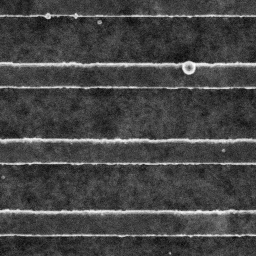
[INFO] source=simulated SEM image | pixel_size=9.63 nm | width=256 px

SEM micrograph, lines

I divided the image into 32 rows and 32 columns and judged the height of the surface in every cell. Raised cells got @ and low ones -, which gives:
@@@@@@@@@@@@@@@@@@@@@@@@@@@@@@@@
@@@@@@@@@@@@@@@@@@@@@@@@@@@@@@@@
--------------------------------
--------------------------------
--------------------------------
--------------------------------
--------------------------------
--------------------------------
@@@@@@@@@@@@@@@@@@@@@@@@@@@@@@@@
@@@@@@@@@@@@@@@@@@@@@@@@@@@@@@@@
@@@@@@@@@@@@@@@@@@@@@@@@@@@@@@@@
--------------------------------
--------------------------------
--------------------------------
--------------------------------
--------------------------------
--------------------------------
---@@@--------------------------
@@@@@@@@@@@@@@@@@@@@@@@@@@@@@@@@
@@@@@@@@@@@@@@@@@@@@@@@@@@@@@@@@
--------------------------------
--------------------------------
--------------------------------
--------------------------------
--------------------------------
--------------------------------
@@@@-@-@@@@@@@@@@@@@@@@-@@@@@@@@
@@@@@@@@@@@@@@@@@@@@@@@@@@@@@@@@
@@@@@@@@@@@@@@@@@@@@@@@@@@@@@@@@
--------------@@@------@-----@--
--------------------------------
--------------------------------